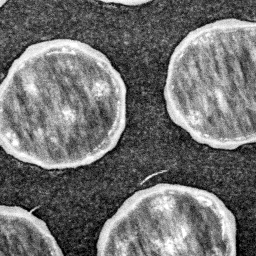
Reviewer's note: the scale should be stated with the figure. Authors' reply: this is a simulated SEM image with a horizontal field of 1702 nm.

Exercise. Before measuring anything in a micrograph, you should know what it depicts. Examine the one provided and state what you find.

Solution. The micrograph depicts raised bodies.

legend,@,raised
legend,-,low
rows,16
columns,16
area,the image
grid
----------------
--------------@-
------------@@@@
--@@@@-----@@@@@
-@@@@@@----@@@@@
@@@@@@@@--@@@@@@
@@@@@@@@---@@@@@
@@@@@@@@---@@@@@
@@@@@@@-----@@@@
-@@@@@@---------
----------------
----------------
--------@@@@@---
@@-----@@@@@@@--
@@@---@@@@@@@@@-
@@@@--@@@@@@@@@-